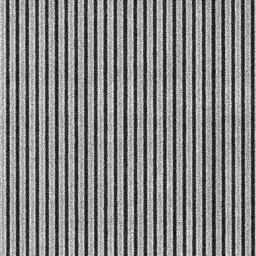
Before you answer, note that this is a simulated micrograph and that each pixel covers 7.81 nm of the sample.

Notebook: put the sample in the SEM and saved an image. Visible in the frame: parallel lines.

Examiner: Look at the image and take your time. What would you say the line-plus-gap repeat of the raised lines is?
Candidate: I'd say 76.6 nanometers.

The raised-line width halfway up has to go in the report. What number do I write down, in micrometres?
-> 0.0449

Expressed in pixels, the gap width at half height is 3.88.